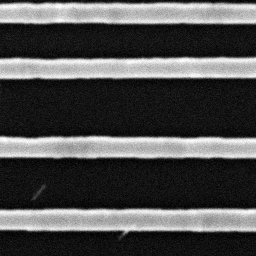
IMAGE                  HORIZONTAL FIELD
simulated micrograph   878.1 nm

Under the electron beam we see lines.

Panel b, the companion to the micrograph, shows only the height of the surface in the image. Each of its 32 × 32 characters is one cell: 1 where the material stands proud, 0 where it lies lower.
00000000000000000000000000000000
11111111111111111111111111111111
11111111111111111111111111111111
00000000000000000000000000000000
00000000000000000000000000000000
00000000000000000000000000000000
00000000000000000000000000000000
11111101111111111111111111111111
11111111111111111111111111111111
11111111111111111111111111111111
00000000000000000000000000000000
00000000000000000000000000000000
00000000000000000000000000000000
00000000000000000000000000000000
00000000000000000000000000000000
00000000000000000000000000000000
00000000000000000000000000000000
11111111111111111111111111111111
11111111111111111111111111111111
11111111111111111111111111111111
00000000000000000000000000000000
00000000000000000000000000000000
00000000000000000000000000000000
00000000000000000000000000000000
00000000000000000000000000000000
00000000000000000000000000000000
11111111111111111111111111111111
11111111111111111111111111111111
11111111111111111111111111111111
00000000000000000000000000000000
00000000000000000000000000000000
00000000000000000000000000000000